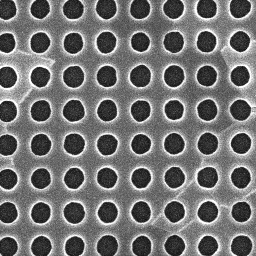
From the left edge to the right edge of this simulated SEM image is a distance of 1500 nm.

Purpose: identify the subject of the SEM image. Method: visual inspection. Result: a regular array of holes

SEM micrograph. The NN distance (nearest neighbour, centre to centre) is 195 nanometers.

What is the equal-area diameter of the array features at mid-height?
127 nanometers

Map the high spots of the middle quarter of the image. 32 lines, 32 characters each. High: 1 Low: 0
11001111110011111100011111000111
00000111100001111000001110000011
00000111000001110000001110000011
00000111000001110000001110000011
00000111000001110000001110000011
10001111110011111100011111000111
11111111111111111111111111111111
11111111111111111111111111111111
11111111111111111111111111111111
10001111100001111100011111000111
00000111100001111000001110000011
00000111000001110000001110000011
00000111000000111000001110000011
00000111100001111000011111000111
11011111110111111100111111111111
11111111111111111111111111111111
11111111111111111111111111111111
10001111111011111100111111000111
00000111100001111000011110000011
00000111000000111000001110000011
00000111000001111000001110000011
00000111000001111000011110000011
10001111100011111100111111000111
11111111111111111111111111111111
11111111111111111111111111111111
11111111111111111111111111111111
10001111100001111100011111000011
00000111000001111000001110000011
00000111000001111000001110000011
00000111000001111000001110000011
00001111100001111000011111000011
11111111111111111111111111111111